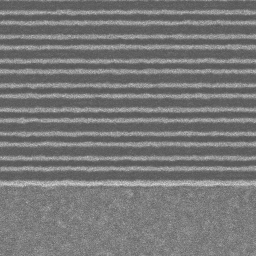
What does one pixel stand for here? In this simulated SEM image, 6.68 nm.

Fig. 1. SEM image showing parallel lines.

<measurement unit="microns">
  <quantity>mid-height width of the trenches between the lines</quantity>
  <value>0.0559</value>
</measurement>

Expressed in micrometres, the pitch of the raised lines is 0.0814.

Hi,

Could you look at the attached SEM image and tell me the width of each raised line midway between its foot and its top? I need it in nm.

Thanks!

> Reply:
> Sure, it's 28.4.